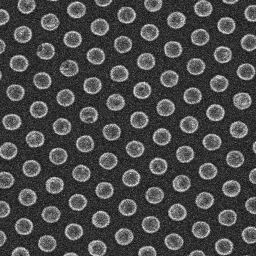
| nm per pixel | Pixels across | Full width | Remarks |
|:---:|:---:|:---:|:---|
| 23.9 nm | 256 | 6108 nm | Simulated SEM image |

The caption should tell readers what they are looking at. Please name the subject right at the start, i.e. a regular array of raised bodies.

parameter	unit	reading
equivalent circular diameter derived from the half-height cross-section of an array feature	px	16.4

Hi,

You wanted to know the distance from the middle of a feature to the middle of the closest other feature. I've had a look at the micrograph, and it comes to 685 nanometers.